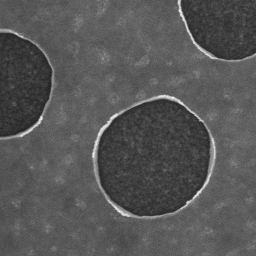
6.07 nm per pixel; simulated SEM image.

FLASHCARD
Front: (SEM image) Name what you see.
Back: holes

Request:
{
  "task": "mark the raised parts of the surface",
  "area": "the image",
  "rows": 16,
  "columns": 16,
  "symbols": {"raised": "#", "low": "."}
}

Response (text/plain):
###########.....
############....
..##########....
...##########...
...#############
...#############
...######..#####
..#####.....####
.#####.......###
######.......###
######.......###
######.......###
#######.....####
#########.######
################
################